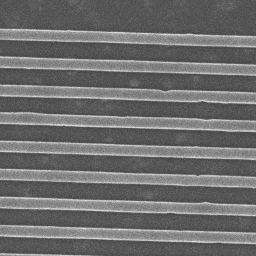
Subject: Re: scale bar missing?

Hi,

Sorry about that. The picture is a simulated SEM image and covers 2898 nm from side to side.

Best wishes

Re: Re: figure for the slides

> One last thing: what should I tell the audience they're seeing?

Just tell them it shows parallel lines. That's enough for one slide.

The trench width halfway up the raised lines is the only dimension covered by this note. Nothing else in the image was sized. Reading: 202 nm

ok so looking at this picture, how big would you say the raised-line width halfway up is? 117 nanometers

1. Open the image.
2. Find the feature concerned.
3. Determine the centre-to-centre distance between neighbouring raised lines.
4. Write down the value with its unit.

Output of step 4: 318 nm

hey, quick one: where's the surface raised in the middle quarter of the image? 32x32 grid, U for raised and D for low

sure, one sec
UUUUUUUUUUUUUUUUUUUUUUUUUUUUUUUU
DDDDDDDDDUUUUUUUUUUUUUUUUUUUUUUU
DDDDDDDDDDDDDDDDDDDDDDDDDDDDDDDD
DDDDDDDDDDDDDDDDDDDDDDDDDDDDDDDD
DDDDDDDDDDDDDDDDDDDDDDDDDDDDDDDD
DDDDDDDDDDDDDDDDDDDDDDDDDDDDDDDD
UUUUUUUUUUUUUUUUUUUUDDDDDDDDDDDD
UUUUUUUUUUUUUUUUUUUUUUUUUUUUUUUU
DDDDDDDUUUUUUUUUUUUUUUUUUUUUUUUU
DDDDDDDDDDDDDDDDDDDDDDDDDDDDDDDD
DDDDDDDDDDDDDDDDDDDDDDDDDDDDDDDD
DDDDDDDDDDDDDDDDDDDDDDDDDDDDDDDD
DDDDDDDDDDDDDDDDDDDDDDDDDDDDDDDD
UUUUUUUUUUUUUUUUUUUUUUUUDDDDDDDD
UUUUUUUUUUUUUUUUUUUUUUUUUUUUUUUU
DDDDDUUUUUUUUUUUUUUUUUUUUUUUUUUU
DDDDDDDDDDDDDDDDDDDDDDDDDDDDDDDD
DDDDDDDDDDDDDDDDDDDDDDDDDDDDDDDD
DDDDDDDDDDDDDDDDDDDDDDDDDDDDDDDD
DDDDDDDDDDDDDDDDDDDDDDDDDDDDDDDD
UUUUUUUUUUUUUUUUUUUUUUDDDDDDDDDD
UUUUUUUUUUUUUUUUUUUUUUUUUUUUUUUU
DDDDDDDDDUUUUUUUUUUUUUUUUUUUUUUU
DDDDDDDDDDDDDDDDDDDDDDDDDDDDDDDD
DDDDDDDDDDDDDDDDDDDDDDDDDDDDDDDD
DDDDDDDDDDDDDDDDDDDDDDDDDDDDDDDD
DDDDDDDDDDDDDDDDDDDDDDDDDDDDDDDD
UUUUUUUUUUUUUUUUUUUUDDDDDDDDDDDD
UUUUUUUUUUUUUUUUUUUUUUUUUUUUUUUU
DDDDDDDDUUUUUUUUUUUUUUUUUUUUUUUU
DDDDDDDDDDDDDDDDDDDDDDDDDDDDDDDD
DDDDDDDDDDDDDDDDDDDDDDDDDDDDDDDD